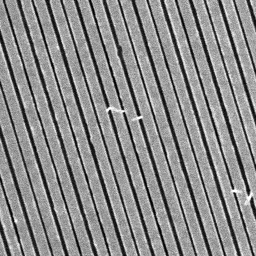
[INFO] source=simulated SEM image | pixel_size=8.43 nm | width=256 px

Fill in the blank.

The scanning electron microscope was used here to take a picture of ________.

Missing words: parallel lines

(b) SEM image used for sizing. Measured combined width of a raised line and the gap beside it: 116 nanometres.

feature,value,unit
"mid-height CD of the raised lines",85.7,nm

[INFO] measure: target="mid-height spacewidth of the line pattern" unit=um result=0.0312